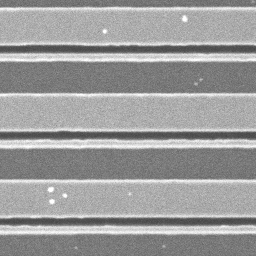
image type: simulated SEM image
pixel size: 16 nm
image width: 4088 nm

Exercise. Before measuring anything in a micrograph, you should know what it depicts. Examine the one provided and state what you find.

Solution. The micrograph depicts lines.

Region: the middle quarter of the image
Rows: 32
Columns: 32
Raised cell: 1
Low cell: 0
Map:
00000000000000000000000000000000
00000000000000000000000000000000
00000000000000000000000000000000
00000000000000000000000000000000
00000000000000000000000000000000
00000000000000000000000000000000
00000000000000000000000000000000
00000000000000000000000000000000
11111111111111111111111111111111
11111111111111111111111111111111
11111111111111111111111111111111
11111111111111111111111111111111
11111111111111111111111111111111
11111111111111111111111111111111
11111111111111111111111111111111
11111111111111111111111111111111
11111111111111111111111111111111
00000000000000000000000000000000
00000000000000000000000000000000
11111111111111111111111111111111
11111111111111111111111111111111
00000000000000000000000000000000
00000000000000000000000000000000
00000000000000000000000000000000
00000000000000000000000000000000
00000000000000000000000000000000
00000000000000000000000000000000
00000000000000000000000000000000
00000000000000000000000000000000
11111111111111111111111111111111
11111111111111111111111111111111
11111111111111111111111111111111